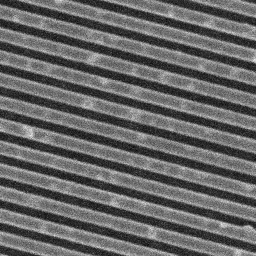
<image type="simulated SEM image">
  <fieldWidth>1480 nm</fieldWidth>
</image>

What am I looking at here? parallel lines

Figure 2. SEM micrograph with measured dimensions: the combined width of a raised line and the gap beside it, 126 nm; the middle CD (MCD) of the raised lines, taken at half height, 0.0719 um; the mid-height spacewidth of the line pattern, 56.6 nm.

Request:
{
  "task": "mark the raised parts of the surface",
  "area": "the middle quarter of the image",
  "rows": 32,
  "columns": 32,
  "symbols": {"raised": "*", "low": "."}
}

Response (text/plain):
........************..........**
**..........************........
******..........************....
**********.........************.
..************.........*********
......************.........*****
..........***********..........*
****.........************.......
*******..........***********....
***********..........***********
...************..........*******
.......************..........***
**.........************.........
*****.........************......
*********.........************..
.************.........**********
.....************.........******
........************.........***
**..........************........
******..........************....
**********..........************
..************..........********
......************.........*****
.........************..........*
****.........************.......
********.........************...
************.........***********
...************..........*******
.......************..........***
*..........************.........
*****..........***********......
*********.........*************.